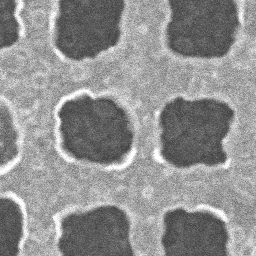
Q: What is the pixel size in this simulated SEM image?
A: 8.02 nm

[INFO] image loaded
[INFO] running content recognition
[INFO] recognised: holes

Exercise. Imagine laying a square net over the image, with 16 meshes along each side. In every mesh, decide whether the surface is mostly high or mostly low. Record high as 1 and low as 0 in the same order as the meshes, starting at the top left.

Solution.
0111000011100001
0110000011100001
0110000111000001
1111001111100011
1111111111111111
1111111111111111
1111000111100011
1111000011000001
1111000011000011
1111000011000011
1111111111101111
1111111111111111
0111111111111111
0111000011000011
0111000011000011
0111000011000011